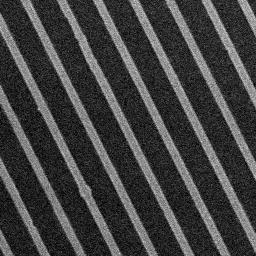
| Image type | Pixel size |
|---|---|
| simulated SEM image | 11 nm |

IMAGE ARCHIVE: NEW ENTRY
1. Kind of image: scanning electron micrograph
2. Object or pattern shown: parallel lines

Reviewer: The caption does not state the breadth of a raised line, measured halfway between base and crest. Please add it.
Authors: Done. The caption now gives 0.0749 µm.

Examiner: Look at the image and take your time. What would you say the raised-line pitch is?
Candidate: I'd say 354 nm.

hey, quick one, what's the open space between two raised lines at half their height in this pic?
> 280 nm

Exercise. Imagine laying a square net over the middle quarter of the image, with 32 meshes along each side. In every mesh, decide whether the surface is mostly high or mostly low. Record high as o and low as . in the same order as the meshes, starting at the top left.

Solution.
.......o........oo.......oo.....
.......oo.......oo.......oo.....
o.......oo.......oo.......oo....
o.......oo.......oo.......oo....
oo.......oo.......oo.......oo...
oo.......oo.......oo.......oo...
.oo.......oo.......oo.......oo..
.oo.......oo.......oo.......oo..
..oo.......oo.......oo.......oo.
..oo.......oo.......oo.......oo.
...oo.......oo.......oo.......oo
...oo.......oo.......oo.......oo
....oo.......oo.......oo.......o
....oo.......oo.......oo.......o
.....oo.......oo.......oo.......
.....oo.......oo.......oo.......
......oo.......oo.......oo......
......oo.......oo.......oo......
.......oo.......oo.......oo.....
.......oo.......oo.......oo.....
o.......oo.......oo.......oo....
o.......oo.......oo.......oo....
oo.......oo.......oo.......oo...
oo.......oo.......oo.......oo...
.oo.......oo.......oo.......oo..
.oo.......oo.......oo.......oo..
..oo.......oo.......oo.......oo.
..oo.......oo.......oo.......oo.
...oo.......oo.......oo.......oo
...oo.......oo.......oo.......oo
....oo.......oo.......oo.......o
....ooo......oo.......oo.......o